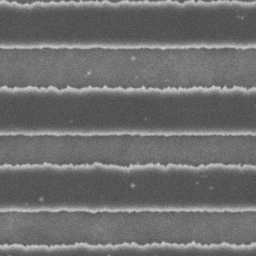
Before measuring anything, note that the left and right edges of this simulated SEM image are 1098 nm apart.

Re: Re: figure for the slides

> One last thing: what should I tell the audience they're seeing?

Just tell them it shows lines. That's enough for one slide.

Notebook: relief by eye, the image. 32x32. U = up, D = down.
UUDDUUUUUUUUUUUUUUUUUUUUUUUUUUUU
UUUUUUUUUUUUUUUUUUUUUUUUUUUUUUUU
UUUUUUUUUUUUUUUUUUUUUUUUUUUUUUUU
UUUUUUUUUUUUUUUUUUUUUUUUUUUUUUUU
UUUUUUUUUUUUUUUUUUUUUUUUUUUUUUUU
UUUUUUUUUUUUUUUUUUUUUUUUUUUUUUUU
DDDDDDDDDDDDDDDDDDDDDDDDDDDDDDDD
DDDDDDDDDDDDDDDDDDDDDDDDDDDDDDDD
DDDDDDDDDDDDDDDDDDDDDDDDDDDDDDDD
DDDDDDDDDDDDDDDDDDDDDDDDDDDDDDDD
DDDDDDDDDDDDDDDDDDDDDDDDDDDDDDDD
UUUUUUUUUUUUUUUUUUUUUUUUUUUUUUUU
UUUUUUUUUUUUUUUUUUUUUUUUUUUUUUUU
UUUUUUUUUUUUUUUUUUUUUUUUUUUUUUUU
UUUUUUUUUUUUUUUUUUUUUUUUUUUUUUUU
UUUUUUUUUUUUUUUUUUUUUUUUUUUUUUUU
UUUUUUUUUUUUUUUUUUUUUUUUUUUUUUUU
DDDDDDDDDDDDDDDDDDDDDDDDDDDDDDDD
DDDDDDDDDDDDDDDDDDDDDDDDDDDDDDDD
DDDDDDDDDDDDDDDDDDDDDDDDDDDDDDDD
DDDDDUDDDDDDUDDDDDDUDDDDDDDUDDDD
UUUUUUUUUUUUUUUUUUUUUUUUUUUUUUUU
UUUUUUUUUUUUUUUUUUUUUUUUUUUUUUUU
UUUUUUUUUUUUUUUUUUUUUUUUUUUUUUUU
UUUUUUUUUUUUUUUUUUUUUUUUUUUUUUUU
UUUUUUUUUUUUUUUUUUUUUUUUUUUUUUUU
DDDDDDDDDDDUDDDDDDDDDDDDDDDDDDDD
DDDDDDDDDDDDDDDDDDDDDDDDDDDDDDDD
DDDDDDDDDDDDDDDDDDDDDDDDDDDDDDDD
DDDDDDDDDDDDDDDDDDDDDDDDDDDDDDDD
DDDDDDDDDDUDDDDUUDDUUUDDUDDDUDDD
UUUUUUUUUUUUUUUUUUUUUUUUUUUUUUUU